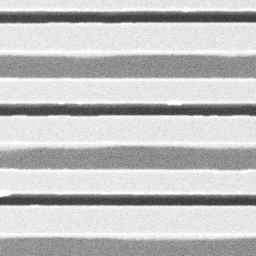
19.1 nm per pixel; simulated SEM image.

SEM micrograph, lines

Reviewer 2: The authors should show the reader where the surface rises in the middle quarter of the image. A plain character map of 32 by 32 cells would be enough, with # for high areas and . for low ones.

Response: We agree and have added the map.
................................
................................
................................
................................
################################
################################
################################
################################
################################
################################
................................
................................
................................
################################
################################
################################
################################
################################
################################
################################
................................
................................
................................
................................
................................
................................
................................
################################
################################
################################
################################
################################